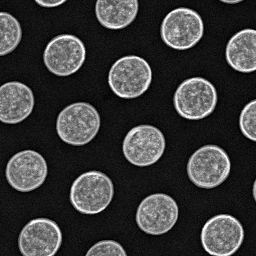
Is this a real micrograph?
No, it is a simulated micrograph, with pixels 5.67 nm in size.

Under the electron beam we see a regular array of raised bodies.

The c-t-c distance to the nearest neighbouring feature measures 391 nanometres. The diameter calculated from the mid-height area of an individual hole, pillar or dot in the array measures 233 nm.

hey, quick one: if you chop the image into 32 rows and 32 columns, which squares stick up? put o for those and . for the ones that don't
.....ooo....ooooo...............
............ooooo....ooo........
oo..........oooo.....oooo.......
oo............o.....ooooo.......
ooo.....o...........ooooo....ooo
oo....oooo...........ooo.....ooo
o.....ooooo.................oooo
......oooo.....ooo..........oooo
......oooo....ooooo..........ooo
..............ooooo.............
.oo...........ooooo....ooo......
oooo..........oooo....ooooo.....
oooo..................ooooo.....
oooo....oooo..........ooooo....o
ooo....ooooo...........ooo....oo
.......ooooo..................oo
.......ooooo....oooo..........oo
........ooo.....oooo............
...............ooooo.....oo.....
..ooo...........oooo....oooo....
.ooooo...........oo.....ooooo...
.ooooo..................ooooo...
.oooo.....oooo..........oooo....
..oo.....ooooo..................
.........ooooo.....oo...........
.........ooooo....oooo..........
..........oo.....ooooo..........
.....o...........ooooo....ooo...
...oooo...........ooo....ooooo..
...ooooo.................ooooo..
..oooooo....ooo..........ooooo..
...oooo....ooooo..........ooo...